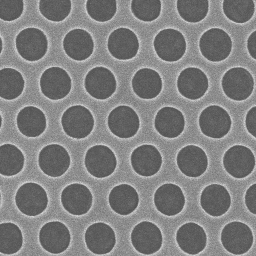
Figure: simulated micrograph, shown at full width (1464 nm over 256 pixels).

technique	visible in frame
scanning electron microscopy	a regular array of holes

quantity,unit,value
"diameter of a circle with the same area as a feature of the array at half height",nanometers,182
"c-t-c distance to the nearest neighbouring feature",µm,0.255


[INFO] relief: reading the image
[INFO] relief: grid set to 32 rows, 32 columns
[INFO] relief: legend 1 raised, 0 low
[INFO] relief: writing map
00011000011000110000110000110000
00011000011000111000110000110000
00111100111100111101111001111001
11111111111111101111111111111111
11000011000111000111000110000110
11000011000010000110000110000110
11000011000011000110000110000110
11100111101111111111101111001111
11111100111101111111111001111011
00011000011000111000110000110001
00011000011000111000110000110000
00011000011000111000110000110001
11111111111111111111111111111011
11101111100111001111001111001110
11000011000011000111000110000110
11000011000011000110000110000110
11100111000111000111000110000110
11111111111111111111111111111111
00111100111000111001111001111001
00011000011000110000110000110000
00011000011000010000110000110000
00111000111000111000111001110001
11111111111111111111111111111111
11000111000111000111001111001110
11000011000111000110000110000110
11000011000111000110000110000110
11100111100111101111001111001110
11111111111111111111111111111111
00111000111000111000111001110001
00011000011000110000110000110000
00011000011000111000110000110000
00111100111000111001111001111001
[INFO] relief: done